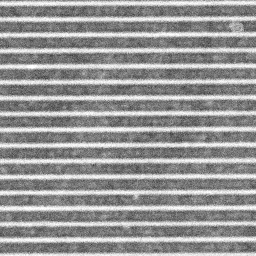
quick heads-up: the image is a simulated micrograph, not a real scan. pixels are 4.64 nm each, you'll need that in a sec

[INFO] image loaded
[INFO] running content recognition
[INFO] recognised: parallel lines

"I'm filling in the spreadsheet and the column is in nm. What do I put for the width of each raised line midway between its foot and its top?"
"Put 12.2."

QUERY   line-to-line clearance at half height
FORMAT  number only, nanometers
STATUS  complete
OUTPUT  59.2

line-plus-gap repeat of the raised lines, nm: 73.2